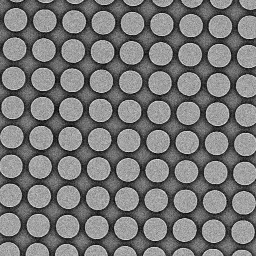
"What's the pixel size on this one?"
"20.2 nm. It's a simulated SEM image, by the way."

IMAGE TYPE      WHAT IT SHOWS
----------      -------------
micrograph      an array of small figures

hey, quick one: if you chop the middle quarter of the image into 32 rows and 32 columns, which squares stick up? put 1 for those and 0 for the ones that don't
00000000000000000000000000000000
01100000000000000000000000000000
11111001111100011110001111000011
11111001111100111110011111100111
11111001111100111110011111100111
11111001111100111110011111100111
11110000111000011110001111000111
00000000000000000000000110000011
00000000000000000000000000000000
11110001111000011100000110000000
11111011111100111110011111000111
11111011111100111110011111101111
11110011111100111110011111001111
11110001111000111110011111001111
00000000000000001000001110000111
00000000000000000000000000000000
11100001110000011000000000000000
11110011111000111100011111000111
11110011111101111110011111001111
11110011111101111110011111001111
11110001111000111110011111001111
01000000110000011100001110000111
00000000000000000000000000000000
11100000100000000000000000000000
11110011111000111100011110000111
11110011111001111110011111001111
11110011111001111110111111001111
11110011111001111110011111001111
11100001110000111100011111001111
00000000000000000000000000000111
00000000000000000000000000000000
11100011110000111000001100000000